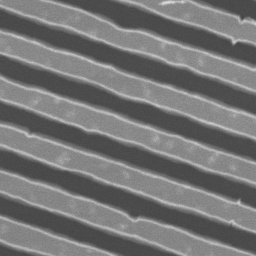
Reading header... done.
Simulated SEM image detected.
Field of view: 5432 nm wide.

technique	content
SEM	parallel lines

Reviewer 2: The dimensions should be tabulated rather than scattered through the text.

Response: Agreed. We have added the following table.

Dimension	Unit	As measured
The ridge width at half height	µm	0.505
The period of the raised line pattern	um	0.936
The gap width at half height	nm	425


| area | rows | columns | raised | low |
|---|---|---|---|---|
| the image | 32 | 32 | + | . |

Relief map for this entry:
++++++++........+++++++++.......
.++++++++++........+++++++++....
....+++++++++........+++++++++++
........+++++++..........+++++++
+++........+++++++++........++++
++++++.......++++++++++........+
+++++++++........+++++++++......
..++++++++++........+++++++++...
.....+++++++++.........+++++++++
........+++++++++.........++++++
++..........++++++++.........+++
++++++........+++++++++.........
+++++++++........+++++++++......
...+++++++++........+++++++++...
.....++++++++++........+++++++++
........++++++++++........++++++
+++........++++++++++........+++
+++++++........+++++++++........
+++++++++.........++++++++......
...++++++++++.......++++++++++..
......++++++++++........++++++++
+.........+++++++++.......++++++
++++........++++++++++........++
+++++++........++++++++++.......
.+++++++++........++++++++++....
....+++++++++.......++++++++++..
.......++++++++.........++++++++
++........+++++++++........+++++
+++++.......++++++++++........++
++++++++.......++++++++++.......
+++++++++++.......++++++++++....
....++++++++++.......++++++++++.